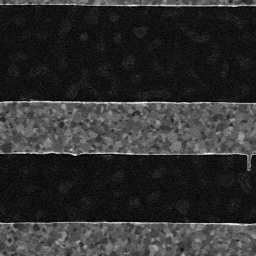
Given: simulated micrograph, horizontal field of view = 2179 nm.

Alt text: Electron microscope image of one or a few lines or trenches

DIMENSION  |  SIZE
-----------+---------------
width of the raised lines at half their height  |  442 nm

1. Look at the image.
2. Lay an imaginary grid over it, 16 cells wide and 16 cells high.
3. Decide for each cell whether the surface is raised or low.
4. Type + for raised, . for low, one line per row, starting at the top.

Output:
................
................
................
................
................
................
++++++++++++++++
++++++++++++++++
++++++++++++++++
++++++++++++++++
................
................
................
................
++++++++++++++++
++++++++++++++++